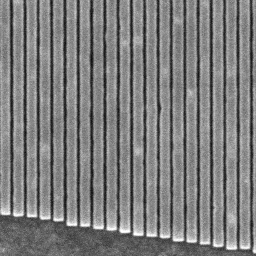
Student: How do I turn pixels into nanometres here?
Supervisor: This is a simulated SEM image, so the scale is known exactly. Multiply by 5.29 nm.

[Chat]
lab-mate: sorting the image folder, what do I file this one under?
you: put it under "parallel lines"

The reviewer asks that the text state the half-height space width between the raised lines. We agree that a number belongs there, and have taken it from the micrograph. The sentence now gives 20.5 nm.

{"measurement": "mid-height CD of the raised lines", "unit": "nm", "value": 51.6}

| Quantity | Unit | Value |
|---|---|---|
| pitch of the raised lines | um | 0.0703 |